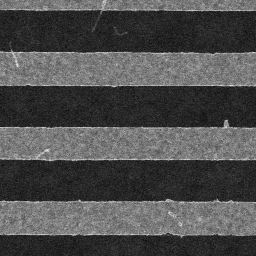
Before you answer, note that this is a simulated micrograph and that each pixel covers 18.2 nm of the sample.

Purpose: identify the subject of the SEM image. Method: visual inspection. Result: one or a few lines or trenches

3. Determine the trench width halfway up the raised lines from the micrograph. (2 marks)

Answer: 758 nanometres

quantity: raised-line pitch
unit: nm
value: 1350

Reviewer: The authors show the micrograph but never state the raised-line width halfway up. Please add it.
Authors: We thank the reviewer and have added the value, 599 nm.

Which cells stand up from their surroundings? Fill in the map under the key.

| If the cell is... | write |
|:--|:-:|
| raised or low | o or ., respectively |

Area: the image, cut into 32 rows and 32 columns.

oooooooooooooooooooooooooooooooo
................................
................................
................................
................................
................................
.o..............................
oooooooooooooooooooooooooooooooo
oooooooooooooooooooooooooooooooo
oooooooooooooooooooooooooooooooo
oooooooooooooooooooooooooooooooo
................................
................................
................................
................................
................................
oooooooooooooooooooooooooooooooo
oooooooooooooooooooooooooooooooo
oooooooooooooooooooooooooooooooo
oooooooooooooooooooooooooooooooo
................................
................................
................................
................................
................................
oooooooooooooooooooooooooooooooo
oooooooooooooooooooooooooooooooo
oooooooooooooooooooooooooooooooo
oooooooooooooooooooooooooooooooo
................................
................................
................................